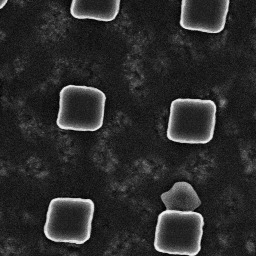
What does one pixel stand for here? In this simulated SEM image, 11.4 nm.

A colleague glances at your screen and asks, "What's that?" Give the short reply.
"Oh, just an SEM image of raised bodies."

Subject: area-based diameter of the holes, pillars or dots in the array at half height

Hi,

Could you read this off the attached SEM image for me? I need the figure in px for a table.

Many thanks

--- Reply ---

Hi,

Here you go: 47.9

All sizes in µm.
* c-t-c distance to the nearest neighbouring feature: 1.26